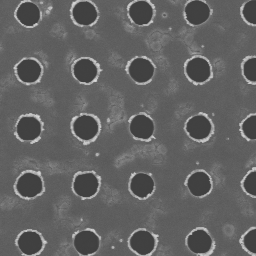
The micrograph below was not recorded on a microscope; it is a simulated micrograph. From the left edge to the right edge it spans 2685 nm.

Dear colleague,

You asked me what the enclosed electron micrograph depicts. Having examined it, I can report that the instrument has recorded a regular array of holes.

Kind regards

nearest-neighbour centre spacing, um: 0.592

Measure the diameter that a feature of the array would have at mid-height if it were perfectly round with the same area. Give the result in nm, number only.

249